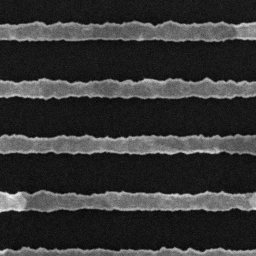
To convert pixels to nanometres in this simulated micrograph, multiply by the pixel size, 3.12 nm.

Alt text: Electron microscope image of lines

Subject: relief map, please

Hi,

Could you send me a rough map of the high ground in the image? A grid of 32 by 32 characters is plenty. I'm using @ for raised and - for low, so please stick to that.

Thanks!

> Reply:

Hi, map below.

--------------------------------
--------------------------------
--------------------------------
@@@@@@@@@@@@@@@@@@@@@@@@@@@@@@@@
@@@@@@@@@@@@@@@@@@@@@@@@@@@@@@@@
--------------------------------
--------------------------------
--------------------------------
--------------------------------
--------------------------------
@@@@@@@@@@@@@@@@@@@@@@@@@@@@@@@@
@@@@@@@@@@@@@@@@@@@@@@@@@@@@@@@@
--------------------------------
--------------------------------
--------------------------------
--------------------------------
--------------------------------
@@@@@@@@@@@@@@@@@@@@@@@@@@@@@@@@
@@@@@@@@@@@@@@@@@@@@@@@@@@@@@@@@
--------------------------------
--------------------------------
--------------------------------
--------------------------------
--------------------------------
@@@@@@@@@@@@@@@@@@@@@@@@@@@@@@@@
@@@@@@@@@@@@@@@@@@@@@@@@@@@@@@@@
--------------------------------
--------------------------------
--------------------------------
--------------------------------
--------------------------------
@@@@@@@@@@@@@@@@@@@@@@@@@@@@@@@@